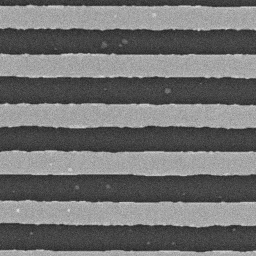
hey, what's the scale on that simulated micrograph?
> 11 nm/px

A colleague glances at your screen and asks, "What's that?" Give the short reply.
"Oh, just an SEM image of lines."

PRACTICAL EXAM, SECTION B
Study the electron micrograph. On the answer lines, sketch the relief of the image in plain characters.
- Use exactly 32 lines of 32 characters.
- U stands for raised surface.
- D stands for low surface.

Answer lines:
DDDDDDDDDDDDDDDDDDDDDDDDDDDDDDDD
UUUUUUUUUUUUUUUUUUUUUUUUUUUUUUUU
UUUUUUUUUUUUUUUUUUUUUUUUUUUUUUUU
DDUUDDDUUDUUUUUUUUUUUUUUUUUUUUUU
DDDDDDDDDDDDDDDDDDDDDDDDDDDDDDDD
DDDDDDDDDDDDDDDDDDDDDDDDDDDDDDDD
DDDDDDDDDDDDDDDDDDDDDDDDDDDDDDDD
UUUUUUUUUUUUUUUUUUUUUUUUUUUUUUUU
UUUUUUUUUUUUUUUUUUUUUUUUUUUUUUUU
DDUUUUUUUUUUUUUUUUUUUUUUUUUUUUUU
DDDDDDDDDDDDDDDDDDDDDDDDDDDDDDDD
DDDDDDDDDDDDDDDDDDDDDDDDDDDDDDDD
DDDDDDDDDDDDDDDDDDDDDDDDDDDDDDDD
UUUUUUUUUUUUUUUUUUUUUUUUUUUUUUUU
UUUUUUUUUUUUUUUUUUUUUUUUUUUUUUUU
UUUUUUUUUUUUUUUUUUUUUUUUUUUUUUUU
DDDDDDDDDDDDDDDDDDDDDDDDDDDDDDDD
DDDDDDDDDDDDDDDDDDDDDDDDDDDDDDDD
DDDDDDDDDDDDDDDDDDDDDDDDDDDDDDDD
UUUUUUUUUUUUUUUUUUUUUUUUUUUUUUUU
UUUUUUUUUUUUUUUUUUUUUUUUUUUUUUUU
UUUUUUUUUUUUUUUUUUUUUUUUUUUUUUUU
DDDDDDDDDDDDDDDDDDDDDDDDDDDDDDDD
DDDDDDDDDDDDDDDDDDDDDDDDDDDDDDDD
DDDDDDDDDDDDDDDDDDDDDDDDDDDDDDDD
UUUUUUUUUUUUUUUUUUUUUUUUUUUUUUUU
UUUUUUUUUUUUUUUUUUUUUUUUUUUUUUUU
UUUUUUUUUUUUUUUUUUUUUUUUUUUUUUUU
DDDDDDDDDDDDDDDDDDDDDDDDDDDDDDDD
DDDDDDDDDDDDDDDDDDDDDDDDDDDDDDDD
DDDDDDDDDDDDDDDDDDDDDDDDDDDDDDDD
UUUUUUUUUUUUUUUUUUUUUUUUUUUUUUUU